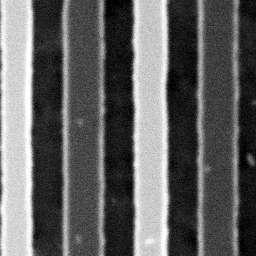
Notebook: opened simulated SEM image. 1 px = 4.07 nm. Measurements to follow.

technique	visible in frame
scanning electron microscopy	lines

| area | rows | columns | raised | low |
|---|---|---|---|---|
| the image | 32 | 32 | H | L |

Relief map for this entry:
HHHHLLLLHHHHHLLLLHHHHLLLLHHHHHLL
HHHHLLLLHHHHHLLLLHHHHLLLLHHHHHLL
HHHHLLLLHHHHHLLLLHHHHLLLLHHHHHLL
HHHHLLLLHHHHHLLLLHHHHLLLLHHHHHLL
HHHHLLLLHHHHHLLLLHHHHLLLLHHHHHLL
HHHHLLLLHHHHHLLLLHHHHLLLLHHHHHLL
HHHHLLLLHHHHHLLLLHHHHLLLLHHHHLLL
HHHHLLLLHHHHHLLLLHHHHLLLLHHHHLLL
HHHHLLLLHHHHHLLLLHHHHLLLLHHHHHLL
HHHHLLLLHHHHHLLLLHHHHLLLLHHHHHLL
HHHHLLLLHHHHHLLLLHHHHLLLLHHHHHLL
HHHHLLLLHHHHHLLLLHHHHLLLLHHHHHLL
HHHHLLLLHHHHHLLLLHHHHLLLLHHHHHLL
HHHHLLLLHHHHHLLLLHHHHLLLLHHHHHLL
HHHHLLLLHHHHHLLLLHHHHLLLLHHHHHLL
HHHHLLLLHHHHHLLLLHHHHLLLLHHHHHLL
HHHHLLLLHHHHHLLLLHHHHLLLLHHHHHLL
HHHHLLLLHHHHHLLLLHHHHLLLLHHHHHLL
HHHHLLLLHHHHHLLLLHHHHLLLLHHHHHLL
HHHHLLLLHHHHHLLLLHHHHLLLLHHHHHLL
HHHHLLLLHHHHHLLLLHHHHLLLLHHHHHLL
HHHHLLLLHHHHHLLLLHHHHLLLLHHHHHLL
HHHHLLLLHHHHHLLLLHHHHLLLLHHHHHLL
HHHHLLLLHHHHHLLLLHHHHLLLLHHHHHLL
HHHHLLLLHHHHHLLLLHHHHLLLLHHHHHLL
HHHHLLLLHHHHHLLLLHHHHLLLLHHHHHLL
HHHHLLLLHHHHHLLLLHHHHLLLLHHHHHLL
HHHHLLLLHHHHHLLLLHHHHLLLLHHHHLLL
HHHHLLLLHHHHHLLLLHHHHLLLLHHHHHLL
HHHHLLLLHHHHHLLLLHHHHLLLLHHHHHLL
HHHHLLLLHHHHHLLLLHHHHLLLLHHHHHLL
HHHHLLLLHHHHHLLLLHHHHLLLLHHHHHLL